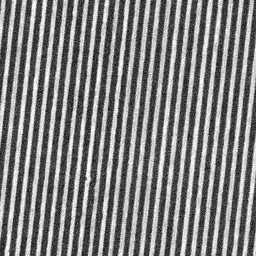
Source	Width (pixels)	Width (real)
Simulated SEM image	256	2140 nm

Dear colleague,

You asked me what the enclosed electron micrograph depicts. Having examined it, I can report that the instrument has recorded parallel lines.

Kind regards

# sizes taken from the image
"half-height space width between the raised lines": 62.3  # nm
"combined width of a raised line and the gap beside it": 85.9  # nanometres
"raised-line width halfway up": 23.9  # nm